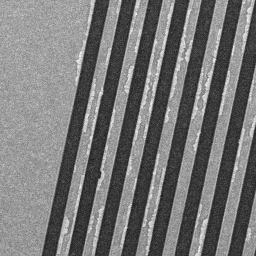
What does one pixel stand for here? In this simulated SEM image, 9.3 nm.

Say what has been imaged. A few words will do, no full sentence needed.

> parallel lines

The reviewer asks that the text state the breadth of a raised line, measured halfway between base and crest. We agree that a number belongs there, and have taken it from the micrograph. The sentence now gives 11.6 pixels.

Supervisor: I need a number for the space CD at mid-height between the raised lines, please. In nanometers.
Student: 134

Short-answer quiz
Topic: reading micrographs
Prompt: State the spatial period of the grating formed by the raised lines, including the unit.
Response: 242 nm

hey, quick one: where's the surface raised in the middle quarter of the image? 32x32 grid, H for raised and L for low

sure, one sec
HHHHLLLLHHHLLLLHHHLLLHHHLLLLHHHL
HHHHLLLLHHHLLLHHHLLLLHHHLLLLHHHL
HHHHLLLLHHLLLLHHHLLLLHHHLLLLHHLL
HHHHLLLHHHLLLLHHHLLLLHHHLLLHHHLL
HHHLLLLHHHLLLLHHHLLLHHHLLLLHHHLL
HHHLLLLHHHLLLLHHLLLLHHHLLLLHHHLL
HHHLLLLHHHLLLHHHLLLLHHHLLLLHHHLL
HHHLLLLHHHLLLHHHLLLLHHHLLLHHHLLL
HHHLLLHHHLLLLHHHLLLLHHHLLLHHHLLL
HHLLLLHHHLLLLHHHLLLHHHLLLLHHHLLL
HHLLLLHHHLLLLHHLLLLHHHLLLLHHHLLL
HHLLLLHHHLLLHHHLLLLHHHLLLLHHHLLL
HHLLLHHHLLLLHHHLLLLHHHLLLHHHLLLL
HLLLLHHHLLLLHHHLLLLHHLLLLHHHLLLL
HLLLLHHHLLLLHHHLLLHHHLLLLHHHLLLL
HLLLLHHHLLLHHHLLLLHHHLLLLHHHLLLH
HLLLLHHHLLLHHHLLLLHHHLLLLHHLLLLH
HLLLHHHLLLLHHHLLLLHHHLLLHHHLLLLH
LLLLHHHLLLLHHHLLLLHHLLLLHHHLLLLH
LLLLHHHLLLLHHHLLLHHHLLLLHHHLLLLH
LLLLHHHLLLHHHLLLLHHHLLLLHHHLLLHH
LLLLHHLLLLHHHLLLLHHHLLLLHHLLLLHH
LLLHHHLLLLHHHLLLLHHHLLLHHHLLLLHH
LLLHHHLLLLHHHLLLHHHLLLLHHHLLLLHH
LLLHHHLLLLHHLLLLHHHLLLLHHHLLLLHH
LLLHHHLLLHHHLLLLHHHLLLLHHHLLLHHH
LLLHHLLLLHHHLLLLHHHLLLHHHLLLLHHH
LLHHHLLLLHHHLLLLHHLLLLHHHLLLLHHH
LLHHHLLLLHHHLLLHHHLLLLHHHLLLLHHH
LLHHHLLLLHHLLLLHHHLLLLHHHLLLHHHL
LLHHHLLLHHHLLLLHHHLLLLHHHLLLHHHL
LHHHLLLLHHHLLLLHHHLLLHHHLLLLHHHL